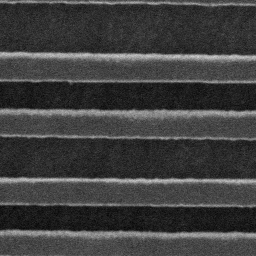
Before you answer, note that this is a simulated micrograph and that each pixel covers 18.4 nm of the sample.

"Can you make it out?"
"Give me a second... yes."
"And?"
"lines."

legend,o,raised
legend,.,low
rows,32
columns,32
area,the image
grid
........................oooooooo
................................
................................
................................
................................
................................
................................
oooooooooooooooooooooooooooooooo
oooooooooooooooooooooooooooooooo
oooooooooooooooooooooooooooooooo
................................
................................
................................
................................
oooooooooooooooooooooooooooooooo
oooooooooooooooooooooooooooooooo
oooooooooooooooooooooooooooooooo
................................
................................
................................
................................
................................
oooooooooooooooooooooooooooooo..
oooooooooooooooooooooooooooooooo
oooooooooooooooooooooooooooooooo
oooooooooooooooooooooooooooooooo
................................
................................
................................
oooooooooooooooooooooooooooooooo
oooooooooooooooooooooooooooooooo
oooooooooooooooooooooooooooooooo